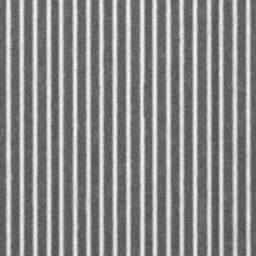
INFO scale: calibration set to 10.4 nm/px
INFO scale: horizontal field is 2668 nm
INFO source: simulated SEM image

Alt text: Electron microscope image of parallel lines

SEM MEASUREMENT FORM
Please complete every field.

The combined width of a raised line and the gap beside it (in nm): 139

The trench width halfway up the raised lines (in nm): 106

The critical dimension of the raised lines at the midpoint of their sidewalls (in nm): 35.2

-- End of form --